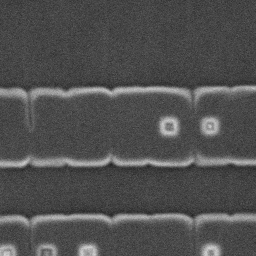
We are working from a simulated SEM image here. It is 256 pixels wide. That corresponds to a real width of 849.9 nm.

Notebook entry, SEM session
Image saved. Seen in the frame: wiring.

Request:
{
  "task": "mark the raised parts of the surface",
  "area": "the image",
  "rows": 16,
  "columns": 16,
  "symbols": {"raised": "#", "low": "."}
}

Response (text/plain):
................
................
................
................
................
...............#
################
################
################
################
................
................
................
....##....#.....
################
################